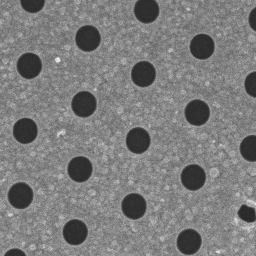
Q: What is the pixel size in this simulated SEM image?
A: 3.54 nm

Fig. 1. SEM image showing a regular array of holes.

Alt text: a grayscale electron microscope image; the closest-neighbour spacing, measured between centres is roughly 64.7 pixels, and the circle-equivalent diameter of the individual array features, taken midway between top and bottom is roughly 0.0888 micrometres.